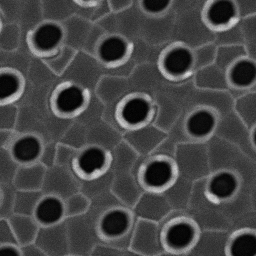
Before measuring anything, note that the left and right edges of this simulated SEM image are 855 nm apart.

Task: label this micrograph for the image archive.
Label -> a regular array of holes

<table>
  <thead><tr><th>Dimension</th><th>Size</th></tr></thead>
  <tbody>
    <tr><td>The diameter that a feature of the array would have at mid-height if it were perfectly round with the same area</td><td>90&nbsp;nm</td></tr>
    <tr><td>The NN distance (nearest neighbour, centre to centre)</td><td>219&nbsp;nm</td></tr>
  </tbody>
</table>